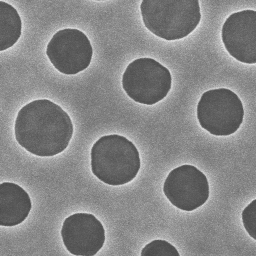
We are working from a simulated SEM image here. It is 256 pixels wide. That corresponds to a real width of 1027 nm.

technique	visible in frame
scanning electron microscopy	holes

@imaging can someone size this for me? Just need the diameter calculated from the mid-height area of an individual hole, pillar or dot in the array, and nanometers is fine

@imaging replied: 191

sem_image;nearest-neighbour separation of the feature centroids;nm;317